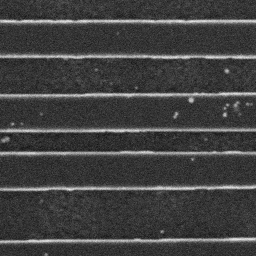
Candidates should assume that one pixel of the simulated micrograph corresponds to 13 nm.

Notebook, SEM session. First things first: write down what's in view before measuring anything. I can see lines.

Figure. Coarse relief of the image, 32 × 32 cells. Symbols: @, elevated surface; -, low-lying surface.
--------------------------------
--------------------------------
--------------------------------
@@@@@@@@@@@@@@@@@@@@@@@@@@@@@@@@
@@@@@@@@@@@@@@@@@@@@@@@@@@@@@@@@
@@@@@@@@@@@@@@@@@@@@@@@@@@@@@@@@
@@@@@@@@@@@@@@@@@@@@@@@@@@@@@@@@
--------------------------------
--------------------------------
--------------------------------
--------------------------------
--------------------------------
@@@@@@@@@@@@@@@@@@@@@@@@@@@@@@@@
@@@@@@@@@@@@@@@@@@@@@@@@@@@@@@@@
@@@@@@@@@@@@@@@@@@@@@@@@@@@@@@@@
@@@@@@@@@@@@@@@@@@@@@@@@@@@@@@@@
--------------------------------
--------------------------------
--------------------------------
@@@@@@@@@@@@@@@@@@@@@@@@@@@@@@@@
@@@@@@@@@@@@@@@@@@@@@@@@@@@@@@@@
@@@@@@@@@@@@@@@@@@@@@@@@@@@@@@@@
@@@@@@@@@@@@@@@@@@@@@@@@@@@@@@@@
@@@@@@@@@@@@@@@@@@@@@@@@@@@@@@@@
--------------------------------
--------------------------------
--------------------------------
--------------------------------
--------------------------------
--------------------------------
@@@@@@@@@@@@@@@@@@@@@@@@@@@@@@@@
@@@@@@@@@@@@@@@@@@@@@@@@@@@@@@@@